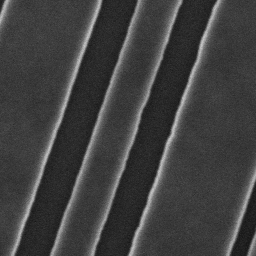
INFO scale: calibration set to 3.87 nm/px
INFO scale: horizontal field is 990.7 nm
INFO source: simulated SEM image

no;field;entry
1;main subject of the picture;lines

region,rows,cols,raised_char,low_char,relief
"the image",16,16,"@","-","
@@@@@@--@@@--@@@
@@@@@@--@@@--@@@
@@@@@@--@@---@@@
@@@@@--@@@--@@@@
@@@@@--@@@--@@@@
@@@@---@@---@@@@
@@@@--@@@--@@@@@
@@@@--@@@--@@@@@
@@@---@@---@@@@@
@@@--@@@--@@@@@@
@@@--@@@--@@@@@@
@@---@@---@@@@@@
@@--@@@--@@@@@@@
@@--@@@--@@@@@@-
@---@@---@@@@@@-
@--@@@--@@@@@@--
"